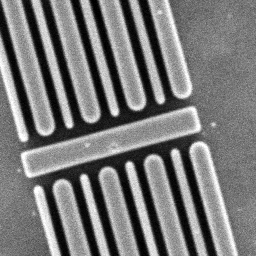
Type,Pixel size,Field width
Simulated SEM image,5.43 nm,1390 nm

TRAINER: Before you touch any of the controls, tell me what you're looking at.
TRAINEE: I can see groups of lines, slits or small figures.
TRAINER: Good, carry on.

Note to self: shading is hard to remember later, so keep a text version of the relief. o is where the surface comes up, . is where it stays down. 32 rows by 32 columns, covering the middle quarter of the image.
.ooooo..ooo..ooooo...oo..ooooo..
.ooooo...oo..ooooo...oo...ooooo.
..ooooo..oo...ooooo..ooo..ooooo.
..ooooo..oo...ooooo...oo..ooooo.
..ooooo..ooo..ooooo...oo..oooooo
..ooooo...oo...ooooo..oo...ooooo
...ooooo..oo...ooooo..ooo..ooooo
...ooooo..ooo..ooooo..ooo...oooo
o..ooooo...oo..ooooo...oo.......
o...oooo...oo...oooo...oo.......
o...ooooo..oo...oooo............
o...ooooo..ooo...oo..........ooo
oo..ooooo...o............ooooooo
oo...oooo.............oooooooooo
oo....o...........oooooooooooooo
.o.............ooooooooooooooooo
...........ooooooooooooooooooooo
.......oooooooooooooooooooooooo.
....oooooooooooooooooooooooo....
ooooooooooooooooooooooo.........
oooooooooooooooooooo............
oooooooooooooooo...........o....
ooooooooooooo..............oo...
ooooooooo............ooo...oo...
oooooo..............ooooo..oo...
o..............oo...ooooo...oo..
.........oooo...oo..ooooo...oo..
.........oooo...oo...ooooo..oo..
....oo...ooooo..oo...ooooo..oo..
o...oo...ooooo...oo..ooooo...oo.
oo...oo..ooooo...oo..ooooo...oo.
oo...oo...oooo...oo...ooooo..oo.